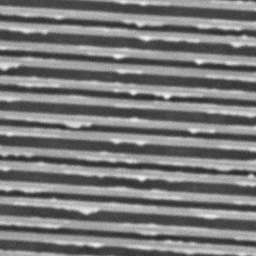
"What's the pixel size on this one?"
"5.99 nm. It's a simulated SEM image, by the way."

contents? parallel lines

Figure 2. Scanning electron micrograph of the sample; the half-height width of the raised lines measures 0.0478 microns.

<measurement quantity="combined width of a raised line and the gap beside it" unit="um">0.104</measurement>